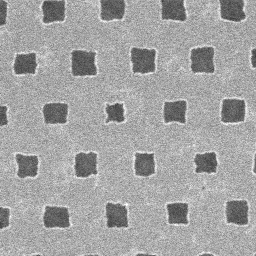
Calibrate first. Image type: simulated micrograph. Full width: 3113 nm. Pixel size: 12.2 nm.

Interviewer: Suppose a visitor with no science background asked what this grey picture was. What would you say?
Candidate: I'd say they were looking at a regular array of holes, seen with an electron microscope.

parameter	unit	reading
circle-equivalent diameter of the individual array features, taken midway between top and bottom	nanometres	319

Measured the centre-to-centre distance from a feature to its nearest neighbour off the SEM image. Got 709 nm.